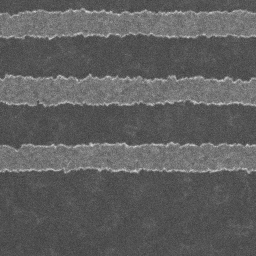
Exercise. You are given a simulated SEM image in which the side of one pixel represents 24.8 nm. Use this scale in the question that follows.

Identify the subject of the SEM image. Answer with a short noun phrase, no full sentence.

one or a few lines or trenches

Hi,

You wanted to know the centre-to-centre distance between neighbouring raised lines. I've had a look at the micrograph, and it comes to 1.66 microns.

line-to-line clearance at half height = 1040 nm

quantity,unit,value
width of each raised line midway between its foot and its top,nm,604